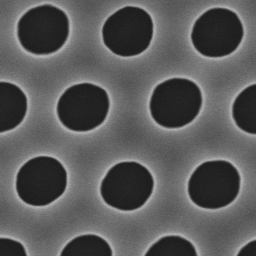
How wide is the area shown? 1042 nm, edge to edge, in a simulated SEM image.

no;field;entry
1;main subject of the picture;a regular array of holes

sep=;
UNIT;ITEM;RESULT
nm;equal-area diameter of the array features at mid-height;205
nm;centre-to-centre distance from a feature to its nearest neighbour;346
